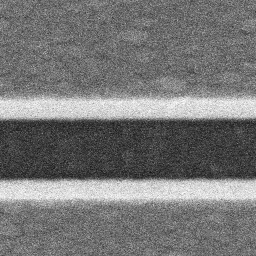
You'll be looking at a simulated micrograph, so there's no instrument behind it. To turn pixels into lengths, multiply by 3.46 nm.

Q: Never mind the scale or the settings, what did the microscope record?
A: one or a few lines or trenches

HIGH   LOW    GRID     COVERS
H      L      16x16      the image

HHHHHHHHHHHHHHHH
HHHHHHHHHHHHHHHH
HHHHHHHHHHHHHHHH
HHHHHHHHHHHHHHHH
HHHHHHHHHHHHHHHH
HHHHHHHHHHHHHHHH
HHHHHHHHHHHHHHHH
LLLLLLLLLLLLLLLL
LLLLLLLLLLLLLLLL
LLLLLLLLLLLLLLLL
LLLLLLLLLLLLLLLL
LLLLLLLLLLLLLLLL
HHHHHHHHHHHHHHHH
HHHHHHHHHHHHHHHH
HHHHHHHHHHHHHHHH
HHHHHHHHHHHHHHHH